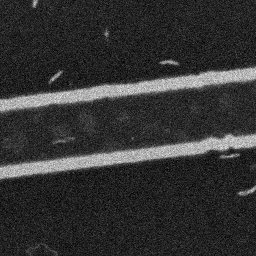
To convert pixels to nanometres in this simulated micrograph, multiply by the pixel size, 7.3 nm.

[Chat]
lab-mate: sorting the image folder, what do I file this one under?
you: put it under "one or a few lines or trenches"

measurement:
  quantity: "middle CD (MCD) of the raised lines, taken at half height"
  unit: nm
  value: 490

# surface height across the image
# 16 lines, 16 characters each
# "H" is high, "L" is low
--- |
LLLLLLLLLLLLLLLL
LLLLLLLLLLLLLLLL
LLLLLLLLLLLLLLLL
LLLLLLLLLLLLLLLL
LLLLLLLLLLLLLLLL
LLLLLLLLLHHHHHHH
LHHHHHHHHHHHHHHH
HHHHHHHHHHHHHHHH
HHHHHHHHHHHHHHHH
HHHHHHHHHHLLLLLL
HHLLLLLLLLLLLLLL
LLLLLLLLLLLLLLLL
LLLLLLLLLLLLLLLL
LLLLLLLLLLLLLLLL
LLLLLLLLLLLLLLLL
LLLLLLLLLLLLLLLL